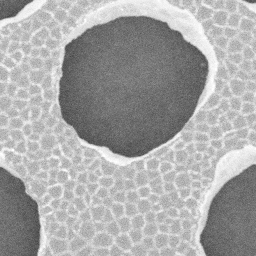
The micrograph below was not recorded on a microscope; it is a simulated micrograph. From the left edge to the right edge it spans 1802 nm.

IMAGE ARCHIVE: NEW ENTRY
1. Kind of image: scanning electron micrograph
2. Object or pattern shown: holes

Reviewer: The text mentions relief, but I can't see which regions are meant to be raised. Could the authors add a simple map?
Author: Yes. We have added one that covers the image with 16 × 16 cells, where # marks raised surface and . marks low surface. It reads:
..#####..#######
#####......#####
####........####
####.........###
####.........###
####.........###
####.........###
####........####
#####......#####
#######..#######
.#############..
..############..
..###########...
..###########...
...#########....
..###########...